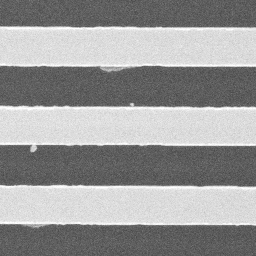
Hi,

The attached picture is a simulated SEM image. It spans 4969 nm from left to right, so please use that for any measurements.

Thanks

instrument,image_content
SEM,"lines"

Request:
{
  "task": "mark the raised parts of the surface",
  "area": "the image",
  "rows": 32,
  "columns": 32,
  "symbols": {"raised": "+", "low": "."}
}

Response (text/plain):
................................
................................
................................
++..............................
++++++++++++++++++++++++++++++++
++++++++++++++++++++++++++++++++
++++++++++++++++++++++++++++++++
++++++++++++++++++++++++++++++++
................................
................................
................................
................................
................................
++++++++++++++++++++..........+.
++++++++++++++++++++++++++++++++
++++++++++++++++++++++++++++++++
++++++++++++++++++++++++++++++++
++++++++++++++++++++++++++++++++
................................
................................
................................
................................
................................
++++++++++++++++++++++++++++++++
++++++++++++++++++++++++++++++++
++++++++++++++++++++++++++++++++
++++++++++++++++++++++++++++++++
++++++++++++++++++++++++++++++++
................................
................................
................................
................................